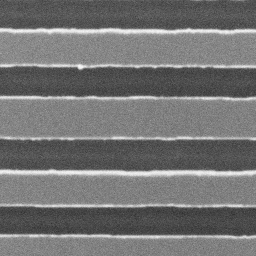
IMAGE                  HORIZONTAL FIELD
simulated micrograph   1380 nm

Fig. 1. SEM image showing lines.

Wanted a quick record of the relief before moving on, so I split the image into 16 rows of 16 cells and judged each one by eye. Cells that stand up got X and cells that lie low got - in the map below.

----------------
----------------
XXXXXXXXXXXXXXXX
XXXXXXXXXXXXXXXX
----------------
----------------
XXXXXXXXXXXXXXXX
XXXXXXXXXXXXXXXX
XXXXXXXXXXXXXXXX
----------------
----------------
XXXXXXXXXXXXXXXX
XXXXXXXXXXXXXXXX
----------------
----------------
XXXXXXXXXXXXXXXX